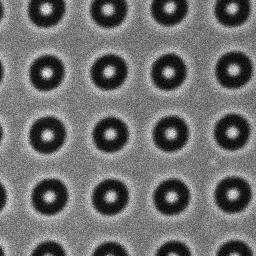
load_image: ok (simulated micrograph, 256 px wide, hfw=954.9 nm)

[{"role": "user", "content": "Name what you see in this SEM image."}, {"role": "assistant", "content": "a regular array of ring-shaped grooves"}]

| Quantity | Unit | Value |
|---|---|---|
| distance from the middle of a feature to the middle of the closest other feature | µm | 0.227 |